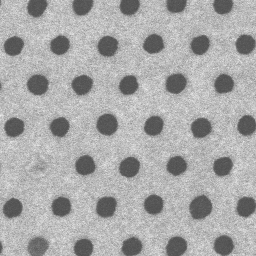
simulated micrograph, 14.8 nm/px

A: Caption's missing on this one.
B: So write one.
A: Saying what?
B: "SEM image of a regular array of holes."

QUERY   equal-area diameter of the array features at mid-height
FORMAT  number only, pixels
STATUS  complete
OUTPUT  20.3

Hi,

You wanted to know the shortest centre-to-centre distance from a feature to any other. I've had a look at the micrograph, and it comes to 670 nanometres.